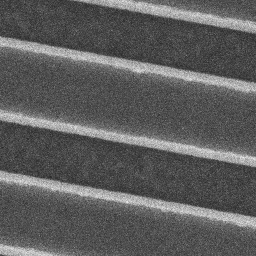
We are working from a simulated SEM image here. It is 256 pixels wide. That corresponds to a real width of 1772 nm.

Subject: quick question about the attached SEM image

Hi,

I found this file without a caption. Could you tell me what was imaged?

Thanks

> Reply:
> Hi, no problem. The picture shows one or a few lines or trenches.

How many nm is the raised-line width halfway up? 527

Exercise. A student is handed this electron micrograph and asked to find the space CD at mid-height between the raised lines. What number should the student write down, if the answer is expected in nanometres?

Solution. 384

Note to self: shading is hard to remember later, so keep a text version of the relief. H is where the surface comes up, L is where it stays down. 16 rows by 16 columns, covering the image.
LLLLLLLLHHHHHHHH
LLLLLLLLLLLLLLHH
LLLLLLLLLLLLLLLL
HHHHHHLLLLLLLLLL
HHHHHHHHHHHLLLLL
HHHHHHHHHHHHHHHH
HHHHHHHHHHHHHHHH
LHHHHHHHHHHHHHHH
LLLLLLHHHHHHHHHH
LLLLLLLLLLLLHHHH
LLLLLLLLLLLLLLLL
HHHLLLLLLLLLLLLL
HHHHHHHHHLLLLLLL
HHHHHHHHHHHHHHLL
HHHHHHHHHHHHHHHH
HHHHHHHHHHHHHHHH